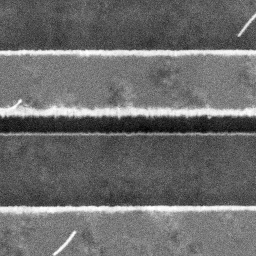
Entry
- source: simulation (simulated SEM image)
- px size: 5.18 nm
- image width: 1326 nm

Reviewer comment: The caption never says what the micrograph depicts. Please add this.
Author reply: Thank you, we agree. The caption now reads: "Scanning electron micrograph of lines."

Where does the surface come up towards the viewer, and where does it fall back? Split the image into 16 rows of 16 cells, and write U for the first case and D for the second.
DDDDDDDDDDDDDDDD
DDDDDDDDDDDDDDDD
DDDDDDDDDDDDDDDD
UUUUUUUUUUUUUUUU
UUUUUUUUUUUUUUUU
UUUUUUUUUUUUUUUU
UUUUUUUUUUUUUUUU
DDDDDDDDDDDDDDDD
DDDDDDDDDDDDDDDD
DDDDDDDDDDDDDDDD
DDDDDDDDDDDDDDDD
DDDDDDDDDDDDDDDD
DDDDDDDDDDDDDDDD
UUUUUUUUUUUUUUUU
UUUUUUUUUUUUUUUU
UUUUUUUUUUUUUUUU